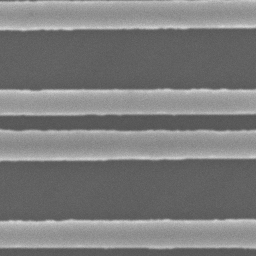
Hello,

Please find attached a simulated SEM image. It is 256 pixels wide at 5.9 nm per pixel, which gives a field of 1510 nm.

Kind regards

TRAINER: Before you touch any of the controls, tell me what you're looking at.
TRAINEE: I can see lines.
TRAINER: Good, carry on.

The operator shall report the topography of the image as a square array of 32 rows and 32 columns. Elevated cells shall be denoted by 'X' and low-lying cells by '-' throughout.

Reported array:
XXXXXXXXXXXXXXXXXXXXXXXXXXXXXXXX
XXXXXXXXXXXXXXXXXXXXXXXXXXXXXXXX
XXXXXXXXXXXXXXXXXXXXXXXXXXXXXXXX
XXXXXXXXXXXXXXXXXXXXXXXX--------
--------------------------------
--------------------------------
--------------------------------
--------------------------------
--------------------------------
--------------------------------
--------------------------------
XXXXXXXXXXXXXXXXXXXXXXXXXXXXXXXX
XXXXXXXXXXXXXXXXXXXXXXXXXXXXXXXX
XXXXXXXXXXXXXXXXXXXXXXXXXXXXXXXX
--------------------------------
--------------------------------
XXXXXXXXXXXXXXXXXXXXXXXXXXXXXXXX
XXXXXXXXXXXXXXXXXXXXXXXXXXXXXXXX
XXXXXXXXXXXXXXXXXXXXXXXXXXXXXXXX
XXXXXXXXXXXXXXXXXXXXXXXXXXXXXXXX
--------------------------------
--------------------------------
--------------------------------
--------------------------------
--------------------------------
--------------------------------
--------------------------------
--------X-----------XX----X-XXXX
XXXXXXXXXXXXXXXXXXXXXXXXXXXXXXXX
XXXXXXXXXXXXXXXXXXXXXXXXXXXXXXXX
XXXXXXXXXXXXXXXXXXXXXXXXXXXXXXXX
--------------------------------